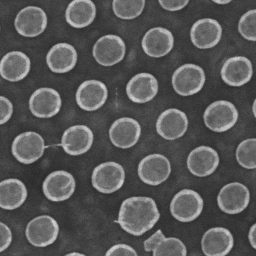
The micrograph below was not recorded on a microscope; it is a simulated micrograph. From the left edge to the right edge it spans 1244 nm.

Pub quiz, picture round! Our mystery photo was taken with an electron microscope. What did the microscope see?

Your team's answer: a regular array of raised bodies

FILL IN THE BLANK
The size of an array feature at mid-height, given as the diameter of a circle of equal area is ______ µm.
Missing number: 0.147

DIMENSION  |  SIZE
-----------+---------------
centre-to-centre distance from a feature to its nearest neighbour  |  231 nm